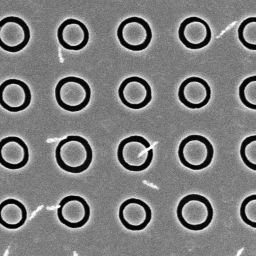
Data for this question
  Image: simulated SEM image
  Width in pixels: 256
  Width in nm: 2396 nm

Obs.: ring-shaped grooves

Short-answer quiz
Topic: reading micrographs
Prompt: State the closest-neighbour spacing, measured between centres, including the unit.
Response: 0.562 µm